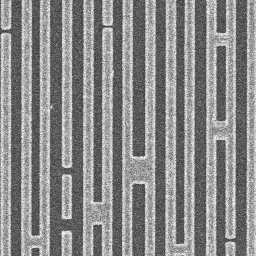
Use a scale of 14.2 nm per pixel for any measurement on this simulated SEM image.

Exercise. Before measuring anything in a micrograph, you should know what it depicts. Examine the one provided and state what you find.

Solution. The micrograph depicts parallel lines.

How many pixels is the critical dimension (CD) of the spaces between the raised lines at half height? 12.9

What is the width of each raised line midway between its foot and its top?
0.117 µm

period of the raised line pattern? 290 nanometers